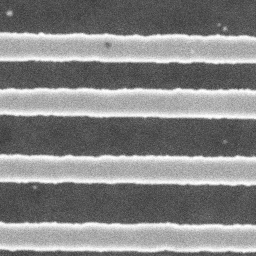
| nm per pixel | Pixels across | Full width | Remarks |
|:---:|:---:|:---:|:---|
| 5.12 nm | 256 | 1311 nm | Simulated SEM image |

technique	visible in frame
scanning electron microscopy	lines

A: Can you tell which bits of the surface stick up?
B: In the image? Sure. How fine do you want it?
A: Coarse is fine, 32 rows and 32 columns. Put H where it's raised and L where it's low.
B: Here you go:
LLLLLLLLLLLLLLLLLLLLLLLLLLLLLLLL
LLLLLLLLLLLLLLLLLLLLLLLLLLLLLLLL
LLLLLLLLLLLLLLLLLLLLLLLLLLLLLLLL
LLLLLLLLLLLLLLLLLLLLLLLLLLLLLLLL
HHHHHHHHHHHHHHHLHHLHHHHHLLLHLLLL
HHHHHHHHHHHHHHHHHHHHHHHHHHHHHHHH
HHHHHHHHHHHHHHHHHHHHHHHHHHHHHHHH
HHHHHHHHHHHHHHHHHHHHHHHHHHHHHHHH
LLLLLLLLLLLLLLLLLLLLLLLLLLLLLLLL
LLLLLLLLLLLLLLLLLLLLLLLLLLLLLLLL
LLLLLLLLLLLLLLLLLLLLLLLLLLLLLLLL
HHHHHHHHHHHHHHHHHHHHHHHHHHHHHHHH
HHHHHHHHHHHHHHHHHHHHHHHHHHHHHHHH
HHHHHHHHHHHHHHHHHHHHHHHHHHHHHHHH
LLLLLLLLLLLLHHLLLLHHHHHHHHHHHHHH
LLLLLLLLLLLLLLLLLLLLLLLLLLLLLLLL
LLLLLLLLLLLLLLLLLLLLLLLLLLLLLLLL
LLLLLLLLLLLLLLLLLLLLLLLLLLLLLLLL
LLLLLLLLLLLLLLLLLLLLLLLLLLLLLLLL
HHHLLLLLLLLLLLLLLLLLLLLLLLLLLLLL
HHHHHHHHHHHHHHHHHHHHHHHHHHHHHHHH
HHHHHHHHHHHHHHHHHHHHHHHHHHHHHHHH
HHHHHHHHHHHHHHHHHHHHHHHHHHHHHHHH
LLLLLLLLLLLLLLLLLLLLLLLLLLLLLLLL
LLLLLLLLLLLLLLLLLLLLLLLLLLLLLLLL
LLLLLLLLLLLLLLLLLLLLLLLLLLLLLLLL
LLLLLLLLLLLLLLLLLLLLLLLLLLLLLLLL
LLLLLLLLLLLLLLLLLLLLLLLLLLLLLLLL
HHHHHHHHHHHHHHHHHHHHHHHHHHHHHHHH
HHHHHHHHHHHHHHHHHHHHHHHHHHHHHHHH
HHHHHHHHHHHHHHHHHHHHHHHHHHHHHHHH
LLLLLLLLLLLLLLLLLLLLLLLLLLLLLLHL